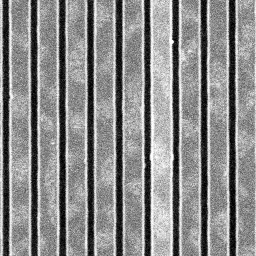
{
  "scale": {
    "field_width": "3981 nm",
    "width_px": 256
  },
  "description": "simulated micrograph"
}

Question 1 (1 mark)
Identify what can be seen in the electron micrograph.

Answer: parallel lines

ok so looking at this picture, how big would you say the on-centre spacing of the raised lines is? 440 nm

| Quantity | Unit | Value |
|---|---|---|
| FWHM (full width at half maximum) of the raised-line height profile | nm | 311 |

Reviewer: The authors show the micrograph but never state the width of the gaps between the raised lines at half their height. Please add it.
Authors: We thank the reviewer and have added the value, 124 nanometres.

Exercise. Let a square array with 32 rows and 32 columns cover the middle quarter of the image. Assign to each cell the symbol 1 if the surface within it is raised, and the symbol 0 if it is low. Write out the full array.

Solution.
01111000111110011111001111100111
01111000111110011111001111100111
01111100111110011111001111100111
01111100111110011111001111100111
01111100111110011111001111100111
01111100111110011111001111100111
01111100111110011111001111100111
01111100111110011111001111100111
01111100111110011111001111100111
01111100111100011111001111100111
01111100111110011111001111100111
01111000111110011111001111100111
01111000111110011111001111100111
01111000111110011111001111100111
01111000111110011111001111100111
01111000111110011111001111100111
01111000111110011111001111100111
01111000111110011111001111100111
01111000111110011111001111100111
01111000111110011111001111100111
01111000111110011111001111100111
01111000111110011111001111100111
01111100111110011111001111100111
01111000111110011111001111100111
01111000111110011111001111100111
01111100111110011111001111100111
01111100111110011111001111100111
01111000111110011111001111100111
01111000111110011111001111100111
01111000111110011111001111100111
01111000111110011111001111100111
01111000111110011111001111100111